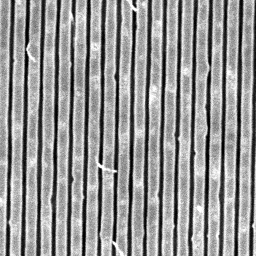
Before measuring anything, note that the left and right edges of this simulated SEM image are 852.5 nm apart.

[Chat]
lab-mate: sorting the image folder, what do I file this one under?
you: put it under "parallel lines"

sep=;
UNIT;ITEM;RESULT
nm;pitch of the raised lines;50.7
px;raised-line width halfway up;10.9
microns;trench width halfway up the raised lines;0.0133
